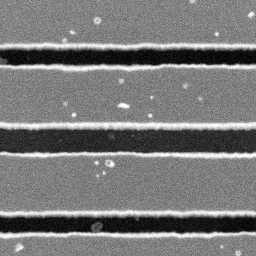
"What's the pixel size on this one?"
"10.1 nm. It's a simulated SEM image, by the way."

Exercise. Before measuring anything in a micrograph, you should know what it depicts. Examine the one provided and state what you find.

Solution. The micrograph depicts lines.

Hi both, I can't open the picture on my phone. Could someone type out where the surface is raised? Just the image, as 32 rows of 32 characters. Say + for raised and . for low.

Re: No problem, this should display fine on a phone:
++++++++++++++++++++++++++++++++
++++++++++++++++++++++++++++++++
++++++++++++++++++++++++++++++++
++++++++++++++++++++++++++++++++
++++++++++++++++++++++++++++++++
++++++++++++++++++++++++++++++++
................................
................................
++++++++++++++++++++++++++++++++
++++++++++++++++++++++++++++++++
++++++++++++++++++++++++++++++++
++++++++++++++++++++++++++++++++
++++++++++++++++++++++++++++++++
++++++++++++++++++++++++++++++++
++++++++++++++++++++++++++++++++
++++++++++++++++++++++++++++++++
................................
................................
................................
++++++++++++++++++++++++++++++++
++++++++++++++++++++++++++++++++
++++++++++++++++++++++++++++++++
++++++++++++++++++++++++++++++++
++++++++++++++++++++++++++++++++
++++++++++++++++++++++++++++++++
++++++++++++++++++++++++++++++++
++++++++++++++++++++++++++++++++
................................
................................
++++++++++++++++++++++++++++++++
++++++++++++++++++++++++++++++++
++++++++++++++++++++++++++++++++